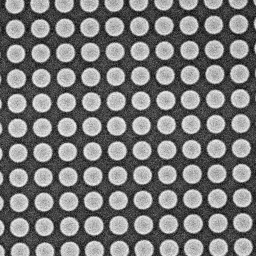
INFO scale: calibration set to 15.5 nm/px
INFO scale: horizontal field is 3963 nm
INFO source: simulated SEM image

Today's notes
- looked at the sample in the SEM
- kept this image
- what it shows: an array of small figures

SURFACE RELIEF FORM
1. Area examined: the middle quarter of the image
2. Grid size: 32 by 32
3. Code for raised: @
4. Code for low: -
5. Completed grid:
--------------------------------
@@----@@----@@----@@@---@@@---@@
@@---@@@@--@@@@--@@@@--@@@@--@@@
@@@--@@@@--@@@@--@@@@--@@@@--@@@
@@---@@@---@@@@---@@@---@@@---@@
--------------------------------
--------------------------------
------@@----@@----@@@---@@@---@@
@@---@@@@--@@@@--@@@@--@@@@@-@@@
@@@--@@@@--@@@@--@@@@--@@@@@--@@
@@@--@@@@--@@@@--@@@@---@@@---@@
@@----@@------------------------
--------------------------------
------------@@----@@----@@@---@@
@@@--@@@@--@@@@--@@@@---@@@@--@@
@@@--@@@@--@@@@--@@@@---@@@@--@@
@@@--@@@@--@@@@---@@@---@@@---@@
@@----@@----@@-----@------------
--------------------------------
-------------------------@-----@
@@---@@@@---@@@---@@@---@@@@--@@
@@@--@@@@--@@@@--@@@@@--@@@@--@@
@@@--@@@@--@@@@---@@@@--@@@@--@@
@@----@@----@@@---@@-----@------
--------------------------------
-------------------------------@
@@----@@@---@@@---@@@---@@@@--@@
@@@--@@@@--@@@@@--@@@@--@@@@--@@
@@@--@@@@--@@@@@--@@@@--@@@@--@@
@@@---@@@---@@@---@@@----@@----@
--------------------------------
--------------------------------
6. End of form